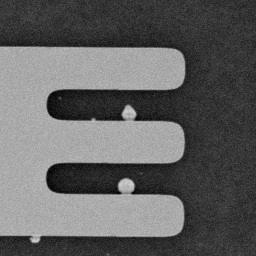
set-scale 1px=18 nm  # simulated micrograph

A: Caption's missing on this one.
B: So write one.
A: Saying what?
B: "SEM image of groups of lines, slits or small figures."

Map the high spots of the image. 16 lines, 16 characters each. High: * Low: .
................
................
................
***********.....
************....
***********.....
***.............
****....*.......
***********.....
***********.....
***.............
***.............
***********.....
***********.....
***********.....
................